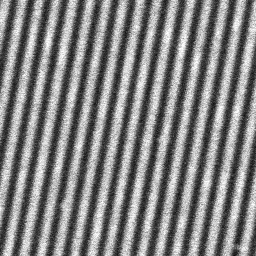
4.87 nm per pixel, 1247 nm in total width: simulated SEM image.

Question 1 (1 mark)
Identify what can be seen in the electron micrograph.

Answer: parallel lines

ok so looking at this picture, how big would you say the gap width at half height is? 37.7 nanometers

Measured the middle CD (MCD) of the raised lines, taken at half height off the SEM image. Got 42.5 nanometers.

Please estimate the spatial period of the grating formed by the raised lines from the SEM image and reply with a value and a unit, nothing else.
80.6 nm